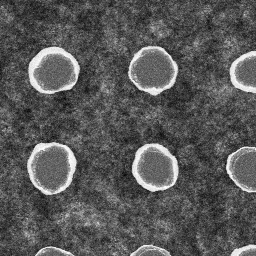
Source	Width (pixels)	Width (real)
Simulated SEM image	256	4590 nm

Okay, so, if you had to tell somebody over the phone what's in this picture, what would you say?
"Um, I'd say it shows raised bodies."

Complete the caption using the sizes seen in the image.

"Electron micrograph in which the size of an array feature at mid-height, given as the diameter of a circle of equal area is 0.811 µm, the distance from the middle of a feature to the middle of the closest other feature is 1740 nm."